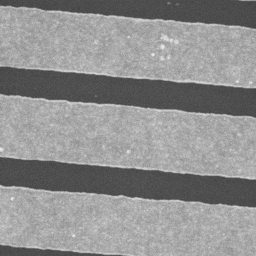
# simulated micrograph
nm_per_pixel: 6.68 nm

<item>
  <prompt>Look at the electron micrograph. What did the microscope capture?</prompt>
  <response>lines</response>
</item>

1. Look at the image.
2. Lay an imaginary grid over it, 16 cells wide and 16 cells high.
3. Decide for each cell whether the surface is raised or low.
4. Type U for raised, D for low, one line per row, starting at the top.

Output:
UUDDDDDDDDDDDDDD
UUUUUUUUUUUUUDDD
UUUUUUUUUUUUUUUU
UUUUUUUUUUUUUUUU
DDDDUUUUUUUUUUUU
DDDDDDDDDDDDDDDD
UUUUUUDDDDDDDDDD
UUUUUUUUUUUUUUUU
UUUUUUUUUUUUUUUU
UUUUUUUUUUUUUUUU
DDDDDDDDUUUUUUUU
DDDDDDDDDDDDDDDD
UUUUUUUUUDDDDDDD
UUUUUUUUUUUUUUUU
UUUUUUUUUUUUUUUU
DDUUUUUUUUUUUUUU